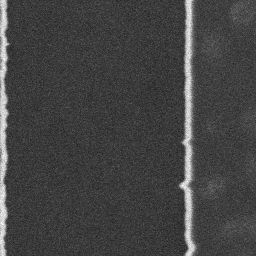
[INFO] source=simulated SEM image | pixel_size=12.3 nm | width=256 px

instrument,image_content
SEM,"one or a few lines or trenches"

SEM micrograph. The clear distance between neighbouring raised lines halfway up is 2.26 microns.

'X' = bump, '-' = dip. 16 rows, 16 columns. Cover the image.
------------XXXX
------------XXXX
------------XXXX
------------XXXX
------------XXXX
------------XXXX
------------XXXX
------------XXXX
------------XXXX
------------XXXX
------------XXXX
------------XXXX
------------XXXX
------------XXXX
------------XXXX
------------XXXX